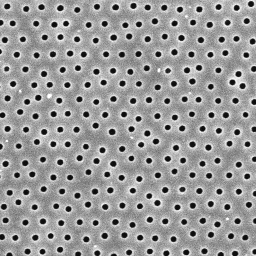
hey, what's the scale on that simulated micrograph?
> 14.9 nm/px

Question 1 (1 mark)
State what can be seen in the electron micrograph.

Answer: a regular array of holes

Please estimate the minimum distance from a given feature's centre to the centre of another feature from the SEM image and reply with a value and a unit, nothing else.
226 nm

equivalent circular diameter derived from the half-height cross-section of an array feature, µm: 0.0921